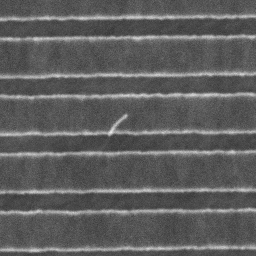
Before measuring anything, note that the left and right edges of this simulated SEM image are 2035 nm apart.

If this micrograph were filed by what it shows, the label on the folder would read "lines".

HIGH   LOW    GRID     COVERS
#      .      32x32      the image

################################
################################
................................
................................
.............................###
################################
################################
################################
################################
#############...................
................................
................................
################################
################################
################################
################################
##############################..
................................
................................
################################
################################
################################
################################
################################
................................
................................
.##.#####.######################
################################
################################
################################
################################
................................